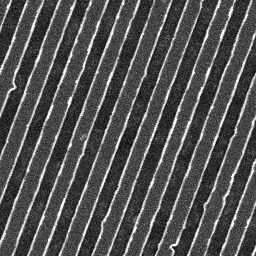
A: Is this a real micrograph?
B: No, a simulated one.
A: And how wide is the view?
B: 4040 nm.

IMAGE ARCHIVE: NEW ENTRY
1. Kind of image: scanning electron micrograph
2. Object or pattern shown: parallel lines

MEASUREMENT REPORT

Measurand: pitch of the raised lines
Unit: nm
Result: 474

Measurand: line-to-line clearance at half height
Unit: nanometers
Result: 233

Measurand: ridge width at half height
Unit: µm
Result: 0.249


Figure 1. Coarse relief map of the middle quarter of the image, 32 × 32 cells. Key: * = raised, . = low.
.****....****....****....****...
*****...*****...*****...****....
****....****....****....****....
****....****...*****....****....
***....****....****....****....*
***....****....****....****....*
***...****....*****....***.....*
**....****....****....****....**
**....****....****....****....**
**...*****...****....****....***
*....****....****....****....***
*....****...*****....****....***
....****....****....****....****
....****....****....****....****
...****....*****....***.....****
...****....****....****....****.
...****....****....****....****.
..****....*****...****.....****.
..****....****....****....****..
..****....****....****....****..
.****....*****...****....****...
.****....****....****....****...
.****...*****....***.....***....
****....****....****....****....
****....****....****....****....
***....****....****.....****...*
***....****....****....****....*
***....****....****....****....*
**....****....****....****....**
**....****....****....****....**
*....*****....***....*****...***
*....****....****....****....***